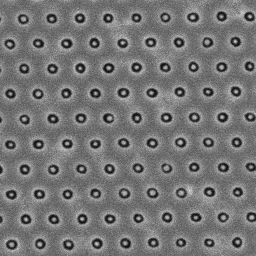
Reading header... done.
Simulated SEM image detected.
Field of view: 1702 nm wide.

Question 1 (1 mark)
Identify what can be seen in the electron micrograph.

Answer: a regular array of ring-shaped grooves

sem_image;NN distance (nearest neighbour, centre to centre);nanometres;185